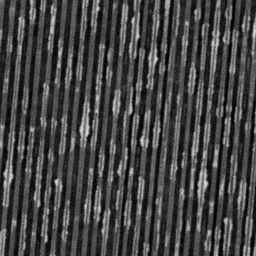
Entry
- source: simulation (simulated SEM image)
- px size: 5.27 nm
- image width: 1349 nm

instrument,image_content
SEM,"parallel lines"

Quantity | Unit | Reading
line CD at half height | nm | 24.3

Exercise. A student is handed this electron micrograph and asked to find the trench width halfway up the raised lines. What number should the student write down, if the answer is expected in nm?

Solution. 29.5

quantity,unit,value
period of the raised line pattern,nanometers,53.7